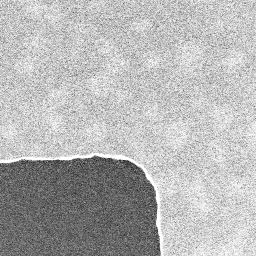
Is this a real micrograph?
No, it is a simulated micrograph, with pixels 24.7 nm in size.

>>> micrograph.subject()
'one or a few lines or trenches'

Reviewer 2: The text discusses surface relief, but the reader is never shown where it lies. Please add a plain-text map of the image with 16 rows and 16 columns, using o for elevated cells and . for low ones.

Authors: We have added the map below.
oooooooooooooooo
oooooooooooooooo
oooooooooooooooo
oooooooooooooooo
oooooooooooooooo
oooooooooooooooo
oooooooooooooooo
oooooooooooooooo
oooooooooooooooo
oooooooooooooooo
.........ooooooo
..........oooooo
..........oooooo
..........oooooo
..........oooooo
..........oooooo